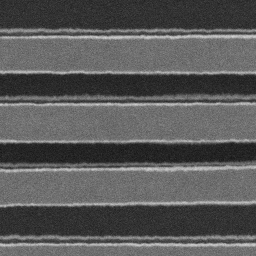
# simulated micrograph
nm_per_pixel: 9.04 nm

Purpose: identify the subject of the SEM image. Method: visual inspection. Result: lines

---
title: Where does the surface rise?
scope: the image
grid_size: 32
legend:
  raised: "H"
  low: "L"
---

LLLLLLLLLLLLLLLLLLLLLLLLLLLLLLLL
LLLLLLLLLLLLLLLLLLLLLLLLLLLLLLLL
LLLLLLLLLLLLLLLLLLLLLLLLLLLLLLLL
LLLLLLLLLLLLLLLLLLLLLLLLLLLLLLLL
LLLLLLLLLLLLLLLLLHLHHLHHHHHHHHHH
HHHHHHHHHHHHHHHHHHHHHHHHHHHHHHHH
HHHHHHHHHHHHHHHHHHHHHHHHHHHHHHHH
HHHHHHHHHHHHHHHHHHHHHHHHHHHHHHHH
HHHHHHHHHHHHHHHHHHHHHHHHHHHHHHHH
LLLLLLLLLLLLLLLLLLLLLLLLLLLLLLLL
LLLLLLLLLLLLLLLLLLLLLLLLLLLLLLLL
LLLLLLLLLLLLLLLLLLLLLLLLLLLLLLLL
LLLLLLLLLLLLLLLLLLLLLLLLLLLLLLLL
HHHHHHHHHHHHHHHHHHHHHHHHHHHHHHHH
HHHHHHHHHHHHHHHHHHHHHHHHHHHHHHHH
HHHHHHHHHHHHHHHHHHHHHHHHHHHHHHHH
HHHHHHHHHHHHHHHHHHHHHHHHHHHHHHHH
HHHHHHHHHHHHHHHHHHHHHHHHHHHHHHHH
LLLLLLLLLLLLLLLLLLLLLLLLLLLLLLLL
LLLLLLLLLLLLLLLLLLLLLLLLLLLLLLLL
LLLLLLLLLLLLLLLLLLLLLLLLLLLLLLLL
HHHHHHHHHHHHHHHHHHHHHHHHHHHHHHHH
HHHHHHHHHHHHHHHHHHHHHHHHHHHHHHHH
HHHHHHHHHHHHHHHHHHHHHHHHHHHHHHHH
HHHHHHHHHHHHHHHHHHHHHHHHHHHHHHHH
HHHHHHHHHHHHHHHHLLLLLLLLLLLLLLLL
LLLLLLLLLLLLLLLLLLLLLLLLLLLLLLLL
LLLLLLLLLLLLLLLLLLLLLLLLLLLLLLLL
LLLLLLLLLLLLLLLLLLLLLLLLLLLLLLLL
LLLLLLLLLLLLLLLLLLLLLLLLLLLLLLLL
HHHHHHHHHHHHHHHHHHHHHHHHHHHHHHHH
HHHHHHHHHHHHHHHHHHHHHHHHHHHHHHHH